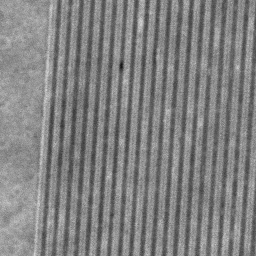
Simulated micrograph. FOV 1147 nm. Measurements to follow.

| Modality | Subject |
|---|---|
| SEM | parallel lines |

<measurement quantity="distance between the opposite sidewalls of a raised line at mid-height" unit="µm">0.0229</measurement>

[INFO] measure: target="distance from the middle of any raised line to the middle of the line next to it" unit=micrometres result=0.0492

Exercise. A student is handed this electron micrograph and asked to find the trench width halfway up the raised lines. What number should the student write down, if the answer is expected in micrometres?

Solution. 0.0262